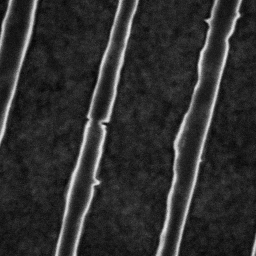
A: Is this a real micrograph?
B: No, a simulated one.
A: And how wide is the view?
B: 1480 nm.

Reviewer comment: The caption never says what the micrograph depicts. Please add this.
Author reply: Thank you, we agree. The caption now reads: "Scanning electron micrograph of one or a few lines or trenches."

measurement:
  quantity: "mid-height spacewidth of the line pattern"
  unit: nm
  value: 449